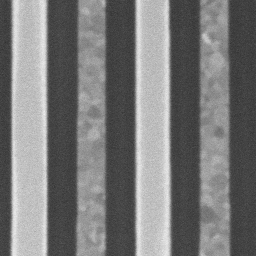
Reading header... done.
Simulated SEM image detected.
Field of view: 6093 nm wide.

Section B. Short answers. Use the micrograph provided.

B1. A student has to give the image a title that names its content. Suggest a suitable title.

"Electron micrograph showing lines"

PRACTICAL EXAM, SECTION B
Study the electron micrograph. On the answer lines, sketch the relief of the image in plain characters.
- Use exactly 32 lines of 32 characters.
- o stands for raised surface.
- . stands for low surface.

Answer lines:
..oooo....ooo....oooo....ooo....
..oooo....ooo....oooo....ooo....
..oooo....ooo....oooo....ooo....
..oooo....ooo....oooo....ooo....
..oooo....ooo....oooo....ooo....
..oooo....ooo....oooo....ooo....
..oooo....ooo....oooo....ooo....
..oooo....ooo....oooo....oooo...
..oooo....ooo....oooo....oooo...
..oooo....ooo....oooo....oooo...
..oooo....ooo....oooo....oooo...
..oooo....ooo....oooo....oooo...
..oooo....ooo....oooo....oooo...
..oooo....ooo....oooo....oooo...
..oooo....ooo....oooo....oooo...
..oooo....ooo....oooo....oooo...
..oooo....ooo....oooo....oooo...
..oooo....ooo....oooo....oooo...
..oooo....ooo....oooo....oooo...
..oooo....ooo....oooo....oooo...
..oooo....ooo....oooo....oooo...
..oooo....ooo....oooo....oooo...
..oooo....ooo....oooo....oooo...
..oooo....ooo....oooo....oooo...
..oooo....ooo....oooo....oooo...
..oooo....ooo....oooo....oooo...
..oooo....ooo....oooo....oooo...
..oooo....ooo....oooo....oooo...
..oooo....ooo....oooo....oooo...
..oooo....ooo....oooo....oooo...
..oooo....ooo....oooo....oooo...
..oooo....ooo....oooo....oooo...